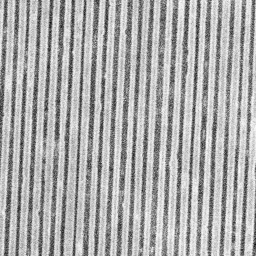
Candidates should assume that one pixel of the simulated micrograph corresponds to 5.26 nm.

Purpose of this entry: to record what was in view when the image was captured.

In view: parallel lines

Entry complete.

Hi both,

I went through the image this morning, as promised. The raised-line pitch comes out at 59.2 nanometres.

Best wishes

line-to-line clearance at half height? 29.5 nm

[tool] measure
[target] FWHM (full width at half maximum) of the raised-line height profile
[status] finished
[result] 29.5 nanometres